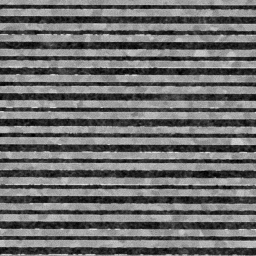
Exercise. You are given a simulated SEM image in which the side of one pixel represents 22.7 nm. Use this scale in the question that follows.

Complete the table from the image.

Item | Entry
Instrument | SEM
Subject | parallel lines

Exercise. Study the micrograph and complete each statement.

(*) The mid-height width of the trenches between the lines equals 140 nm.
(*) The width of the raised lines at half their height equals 6.38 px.